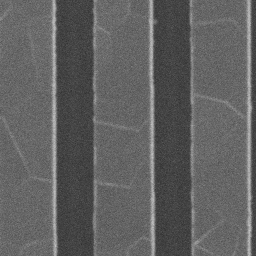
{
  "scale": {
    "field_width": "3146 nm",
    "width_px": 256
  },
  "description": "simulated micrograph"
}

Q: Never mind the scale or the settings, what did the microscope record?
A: lines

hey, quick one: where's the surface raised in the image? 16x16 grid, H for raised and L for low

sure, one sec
HHHLLLHHHLLLHHHH
HHHLLLHHHHLLHHHH
HHHLLLHHHHLLHHHH
HHHLLLHHHHLLHHHH
HHHLLLHHHHLLHHHH
HHHLLLHHHHLLHHHH
HHHLLLHHHHLLHHHH
HHHLLLHHHHLLHHHH
HHHLLLHHHHLLHHHH
HHHLLLHHHHLLHHHH
HHHLLLHHHHLLHHHH
HHHLLLHHHHLLHHHH
HHHLLLHHHHLLHHHH
HHHLLLHHHHLLHHHH
HHHLLLHHHHLLHHHH
HHHLLLHHHHLLHHHH